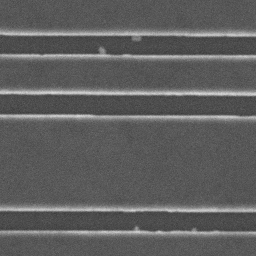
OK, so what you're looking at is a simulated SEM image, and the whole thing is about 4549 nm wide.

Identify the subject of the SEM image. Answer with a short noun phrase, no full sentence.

lines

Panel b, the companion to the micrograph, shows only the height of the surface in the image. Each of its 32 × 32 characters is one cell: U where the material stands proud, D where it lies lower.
UUUUUUUUUUUUUUUUUUUUUUUUUUUUUUUU
UUUUUUUUUUUUUUUUUUUUUUUUUUUUUUUU
UUUUUUUUUUUUUUUUUUUUUUUUUUUUUUUU
UUUUUUUUUUUUUUUUUUUUUUUUUUUUUUUU
DDDDDDDDDDDDDDDDDDDDDDDDDDDDDDDD
DDDDDDDDDDDDDDDDDDDDDDDDDDDDDDDD
DDDDDDDDDDDDDDDDDDDDDDDDDDDDDDDD
UUUUUUUUUUUUUUUUUUUUUUUUUUUUUUUU
UUUUUUUUUUUUUUUUUUUUUUUUUUUUUUUU
UUUUUUUUUUUUUUUUUUUUUUUUUUUUUUUU
UUUUUUUUUUUUUUUUUUUUUUUUUUUUUUUU
UUUUUUUUUUUUUUUUUUUUUUUUUUUUUUUU
DDDDDDDDDDDDDDDDDDDDDDDDDDDDDDDD
DDDDDDDDDDDDDDDDDDDDDDDDDDDDDDDD
UUUUUUUUUUDDDDDDDDDDDDDDDDDDDDDD
UUUUUUUUUUUUUUUUUUUUUUUUUUUUUUUU
UUUUUUUUUUUUUUUUUUUUUUUUUUUUUUUU
UUUUUUUUUUUUUUUUUUUUUUUUUUUUUUUU
UUUUUUUUUUUUUUUUUUUUUUUUUUUUUUUU
UUUUUUUUUUUUUUUUUUUUUUUUUUUUUUUU
UUUUUUUUUUUUUUUUUUUUUUUUUUUUUUUU
UUUUUUUUUUUUUUUUUUUUUUUUUUUUUUUU
UUUUUUUUUUUUUUUUUUUUUUUUUUUUUUUU
UUUUUUUUUUUUUUUUUUUUUUUUUUUUUUUU
UUUUUUUUUUUUUUUUUUUUUUUUUUUUUUUU
UUUUUUUUUUUUUUUUUUUUUUUUUUUUUUUU
DDDDDDDDDDDDDDDDDDDDDDDDDDDDDDDD
DDDDDDDDDDDDDDDDDDDDDDDDDDDDDDDD
DDDDDDDDDDDDDDDDDDDDDDDDDDDDDDDD
UUUUUUUUUUUUUUUUUUUUUUUUUUUUUUUU
UUUUUUUUUUUUUUUUUUUUUUUUUUUUUUUU
UUUUUUUUUUUUUUUUUUUUUUUUUUUUUUUU